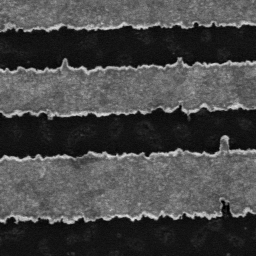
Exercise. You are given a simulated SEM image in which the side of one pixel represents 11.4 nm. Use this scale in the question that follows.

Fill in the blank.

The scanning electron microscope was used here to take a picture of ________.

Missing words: one or a few lines or trenches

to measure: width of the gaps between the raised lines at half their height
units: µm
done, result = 0.469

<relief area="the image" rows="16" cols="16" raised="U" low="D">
UUUUUUUUUUUUUUUU
UUUUUUUUUUUUUUUU
DDDDDDDDDDDDDDDD
DDDDDDDDDDDDDDDD
UUUUUUUUUUUUUUUU
UUUUUUUUUUUUUUUU
UUUUUUUUUUUUUUUU
DDDDDDDDDDDDDDDD
DDDDDDDDDDDDDDDD
DDDDDDDDDDDUDUUU
UUUUUUUUUUUUUUUU
UUUUUUUUUUUUUUUU
UUUUUUUUUUUUUUUU
UUUUUUUUUUUDDDDD
DDDDDDDDDDDDDDDD
DDDDDDDDDDDDDDDD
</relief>